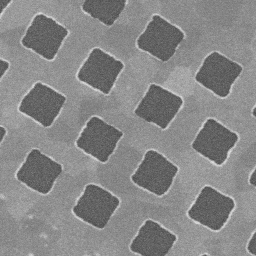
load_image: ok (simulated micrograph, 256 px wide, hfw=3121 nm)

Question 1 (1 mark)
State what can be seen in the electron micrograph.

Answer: a regular array of holes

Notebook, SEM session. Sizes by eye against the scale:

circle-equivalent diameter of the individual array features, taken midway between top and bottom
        0.5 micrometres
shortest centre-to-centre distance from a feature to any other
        807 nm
